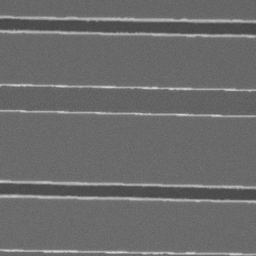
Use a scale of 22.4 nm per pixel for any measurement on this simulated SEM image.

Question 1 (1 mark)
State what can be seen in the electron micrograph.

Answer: lines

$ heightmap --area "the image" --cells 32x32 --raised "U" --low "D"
UUUUUUUUUUUUUUUUUUUUUUUUUUUUUUUU
UUUUUUUUUUUUUUUUUUUUUUUUUUUUUUUU
DDDDDDDDDDDDDDDDDDDUUUUUUUUUUUUU
DDDDDDDDDDDDDDDDDDDDDDDDDDDDDDDD
UUUUUUUUUUUUUUUUUUUUUUUUUUDDDDDD
UUUUUUUUUUUUUUUUUUUUUUUUUUUUUUUU
UUUUUUUUUUUUUUUUUUUUUUUUUUUUUUUU
UUUUUUUUUUUUUUUUUUUUUUUUUUUUUUUU
UUUUUUUUUUUUUUUUUUUUUUUUUUUUUUUU
UUUUUUUUUUUUUUUUUUUUUUUUUUUUUUUU
UUUUUUUUUUUUUUUUUUUUUUUUUUUUUUUU
DDDDDDDDDDDDDDDDDDDDDDDDDDDDDDDD
DDDDDDDDDDDDDDDDDDDDDDDDDDDDDDDD
DDDDDDDDDDDDDDDDDDDDDDDDDDDDDDDD
UUUUUUUUUUUUUUUUUUUUUUUUUUUUDDDD
UUUUUUUUUUUUUUUUUUUUUUUUUUUUUUUU
UUUUUUUUUUUUUUUUUUUUUUUUUUUUUUUU
UUUUUUUUUUUUUUUUUUUUUUUUUUUUUUUU
UUUUUUUUUUUUUUUUUUUUUUUUUUUUUUUU
UUUUUUUUUUUUUUUUUUUUUUUUUUUUUUUU
UUUUUUUUUUUUUUUUUUUUUUUUUUUUUUUU
UUUUUUUUUUUUUUUUUUUUUUUUUUUUUUUU
UUUUUUUUUUUUUUUUUUUUUUUUUUUUUUUU
DDDDDDDDDDDDDDDDDDDDDDDDDDDDDDDD
DDDDDDDDDDDDDDDDDDDDDDDDDDDDDDDD
UUUUUUUUUUUUUUUUUUUUUUUUUUUUUUUU
UUUUUUUUUUUUUUUUUUUUUUUUUUUUUUUU
UUUUUUUUUUUUUUUUUUUUUUUUUUUUUUUU
UUUUUUUUUUUUUUUUUUUUUUUUUUUUUUUU
UUUUUUUUUUUUUUUUUUUUUUUUUUUUUUUU
UUUUUUUUUUUUUUUUUUUUUUUUUUUUUUUU
DDDDDDDDDDDDDUUUUUUUUUUUUUUUUUUU